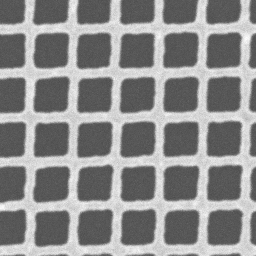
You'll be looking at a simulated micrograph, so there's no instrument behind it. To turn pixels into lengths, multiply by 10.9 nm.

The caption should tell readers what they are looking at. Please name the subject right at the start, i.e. a regular array of holes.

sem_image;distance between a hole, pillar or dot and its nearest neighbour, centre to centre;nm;470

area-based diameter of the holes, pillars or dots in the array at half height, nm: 435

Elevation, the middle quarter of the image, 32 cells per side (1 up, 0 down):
01100000000111000000000110000000
11110111111111111111111111111111
11111111111111111111111111111111
01111000000011110000000111000000
00110000000011000000000110000000
00100000000011000000000110000000
01100000000011000000000110000000
01100000000011000000000110000000
01100000000011000000000110000000
01100000000011000000000110000000
01100000000011000000000110000000
01100000000011000000001110000000
11111111111111111111111111111111
11111111111111111111111111111111
01111000000011110000001111001000
01110000000011000000000110000000
00100000000011000000000110000000
01100000000011000000000110000000
01100000000011000000000110000000
01100000000011000000000110000000
01100000000011000000000110000000
01100000000011000000000110000000
01100000000011000000001110000000
11110001111111100011111111001111
11111111111111111111111111111111
01111100000011100000000111000000
00110000000001000000000110000000
00100000000011000000000110000000
01100000000011000000000110000000
01100000000011000000000110000000
01100000000011000000000110000000
01100000000011000000000110000000